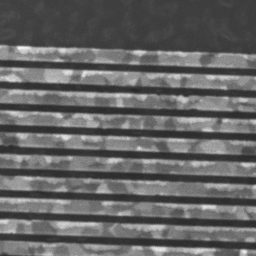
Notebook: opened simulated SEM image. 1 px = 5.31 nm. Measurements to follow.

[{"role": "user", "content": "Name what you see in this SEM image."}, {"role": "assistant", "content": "parallel lines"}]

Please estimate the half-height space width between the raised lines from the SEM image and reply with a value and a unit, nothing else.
47.1 nanometres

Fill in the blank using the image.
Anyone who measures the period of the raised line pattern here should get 115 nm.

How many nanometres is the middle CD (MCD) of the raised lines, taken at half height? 68.4